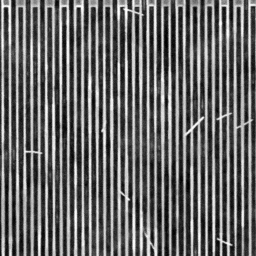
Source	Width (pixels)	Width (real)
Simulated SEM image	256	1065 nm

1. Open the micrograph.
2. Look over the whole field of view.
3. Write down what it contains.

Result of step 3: parallel lines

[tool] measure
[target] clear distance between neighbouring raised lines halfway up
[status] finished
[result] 22.9 nm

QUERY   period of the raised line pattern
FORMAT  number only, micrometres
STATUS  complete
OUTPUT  0.0302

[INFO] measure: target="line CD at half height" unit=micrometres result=0.0083